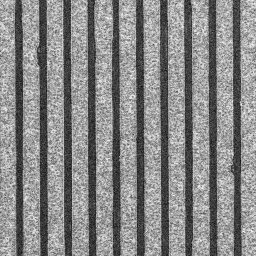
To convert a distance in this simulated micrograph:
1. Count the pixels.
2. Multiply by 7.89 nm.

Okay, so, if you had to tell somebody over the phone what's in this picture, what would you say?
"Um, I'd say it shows parallel lines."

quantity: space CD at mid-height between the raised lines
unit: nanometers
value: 65.1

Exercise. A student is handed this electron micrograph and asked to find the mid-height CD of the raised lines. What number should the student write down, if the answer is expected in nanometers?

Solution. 125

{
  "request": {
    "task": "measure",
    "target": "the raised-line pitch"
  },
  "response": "191 nm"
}